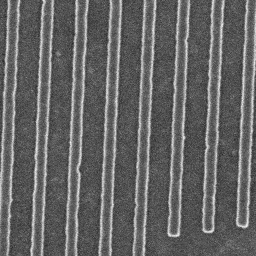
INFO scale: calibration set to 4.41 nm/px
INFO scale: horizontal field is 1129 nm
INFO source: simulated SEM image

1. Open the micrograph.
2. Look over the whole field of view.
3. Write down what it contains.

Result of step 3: parallel lines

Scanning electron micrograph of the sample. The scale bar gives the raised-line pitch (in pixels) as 33.9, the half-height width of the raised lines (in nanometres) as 47.3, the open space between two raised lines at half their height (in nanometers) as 102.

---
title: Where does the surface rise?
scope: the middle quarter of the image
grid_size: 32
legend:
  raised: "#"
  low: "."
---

...##......##.......##......##..
...##......##......###......##..
..###......###.....###......##..
..###......##......###......##..
..###......##......###......##..
..###......##......###......##..
..###......##......###......##..
..###......##......###......##..
..###......##......###......##..
..###......##......###......##..
..###......##......###......##..
..###......##......##.......##..
..##.......##......##......###..
..##......###......##......###..
..##......###......##......###..
..##......###......##......###..
..##......###......##......###..
..##......###......##......###..
..##......###......##......###..
..##......###......##......###..
..##......###......##......###..
..##......###......##......###..
..##......###.....###......###..
.###......###......##......###..
.###......##......###......###..
.###......##......###......###..
.###......##......###......###..
.###......##.......##......##...
.###......##......###......##...
.###......##......###......##...
.###......##......###......##...
.###......##......###......##...